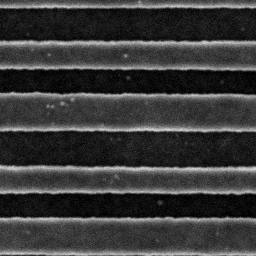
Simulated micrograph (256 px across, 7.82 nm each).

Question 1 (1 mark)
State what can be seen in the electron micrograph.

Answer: lines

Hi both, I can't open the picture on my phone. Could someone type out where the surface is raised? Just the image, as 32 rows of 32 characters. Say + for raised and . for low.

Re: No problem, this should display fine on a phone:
++++++++++++++++++++++++++++++++
................................
................................
................................
................................
++++++++++++++++++++++++++++++++
++++++++++++++++++++++++++++++++
++++++++++++++++++++++++++++++++
++++++++++++++++++++++++++++++++
................................
................................
................................
++++++++++++++++++++++++++++++++
++++++++++++++++++++++++++++++++
++++++++++++++++++++++++++++++++
++++++++++++++++++++++++++++++++
................................
................................
................................
................................
................................
++++++++++++++++++++++++++++++++
++++++++++++++++++++++++++++++++
++++++++++++++++++++++++++++++++
................................
................................
................................
++++++++++++++++++++++++++++++++
++++++++++++++++++++++++++++++++
++++++++++++++++++++++++++++++++
++++++++++++++++++++++++++++++++
++++++++++++++++++++++++++++++++